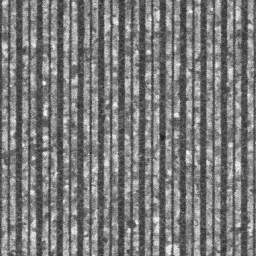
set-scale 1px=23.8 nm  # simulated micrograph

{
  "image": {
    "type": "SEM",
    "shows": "parallel lines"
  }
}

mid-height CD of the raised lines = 122 nanometers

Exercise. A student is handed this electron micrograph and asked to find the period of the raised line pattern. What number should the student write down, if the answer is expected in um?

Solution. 0.244